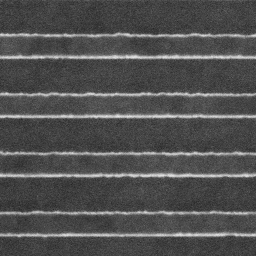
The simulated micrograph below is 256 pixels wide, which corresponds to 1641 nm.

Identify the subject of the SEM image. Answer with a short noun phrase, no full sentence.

lines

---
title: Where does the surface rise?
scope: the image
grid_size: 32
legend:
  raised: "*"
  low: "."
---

................................
................................
................................
................................
******************************.*
********************************
********************************
................................
................................
................................
................................
................................
********************************
********************************
********************************
................................
................................
................................
................................
********************************
********************************
********************************
................................
................................
................................
................................
....****......*..****...*.**....
********************************
********************************
..*.............................
................................
................................